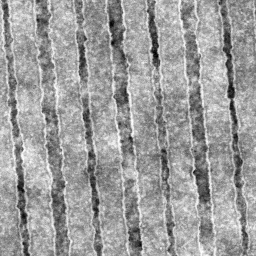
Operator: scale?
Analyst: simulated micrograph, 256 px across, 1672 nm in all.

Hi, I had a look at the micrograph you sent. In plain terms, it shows parallel lines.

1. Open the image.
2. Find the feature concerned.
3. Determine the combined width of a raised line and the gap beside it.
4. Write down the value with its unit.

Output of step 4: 241 nanometres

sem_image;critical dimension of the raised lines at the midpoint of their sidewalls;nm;163